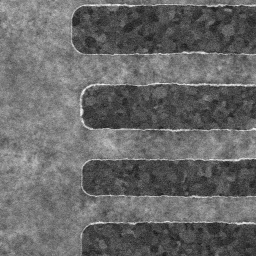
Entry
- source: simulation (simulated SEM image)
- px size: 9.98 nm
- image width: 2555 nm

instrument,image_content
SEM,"one or a few lines or trenches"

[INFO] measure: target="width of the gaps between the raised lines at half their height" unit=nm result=291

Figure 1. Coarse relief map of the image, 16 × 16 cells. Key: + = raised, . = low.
.....+++++++++++
.....+++++++++++
.....+++++++++++
................
................
.....+++++++++++
.....+++++++++++
.....+++++++++++
................
................
.....+++++++++++
.....+++++++++++
................
................
.....+++++++++++
.....+++++++++++